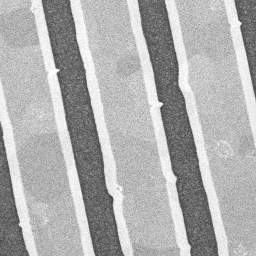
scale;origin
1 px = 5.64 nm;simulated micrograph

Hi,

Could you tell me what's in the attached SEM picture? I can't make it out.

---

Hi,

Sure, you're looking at one or a few lines or trenches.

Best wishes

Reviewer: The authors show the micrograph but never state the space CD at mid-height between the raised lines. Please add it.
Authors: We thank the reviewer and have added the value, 212 nanometres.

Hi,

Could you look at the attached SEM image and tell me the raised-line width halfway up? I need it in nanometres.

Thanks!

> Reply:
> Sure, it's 317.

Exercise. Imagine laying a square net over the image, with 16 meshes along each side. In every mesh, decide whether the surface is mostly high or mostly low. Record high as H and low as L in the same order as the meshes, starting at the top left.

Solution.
HHLLLHHHLLLHHHLL
HHHLLHHHHLLHHHHL
HHHLLHHHHLLHHHHL
HHHLLHHHHLLHHHHL
HHHLLLHHHLLHHHHL
HHHLLLHHHLLLHHHH
HHHHLLHHHHLLHHHH
HHHHLLHHHHLLHHHH
LHHHLLHHHHLLHHHH
LHHHLLLHHHLLLHHH
LHHHLLLHHHLLLHHH
LHHHHLLHHHHLLHHH
LHHHHLLHHHHLLHHH
LHHHHLLHHHHLLHHH
LLHHHLLLHHHLLLHH
LLHHHHLLHHHHLLHH